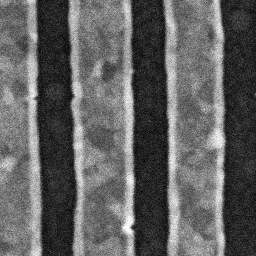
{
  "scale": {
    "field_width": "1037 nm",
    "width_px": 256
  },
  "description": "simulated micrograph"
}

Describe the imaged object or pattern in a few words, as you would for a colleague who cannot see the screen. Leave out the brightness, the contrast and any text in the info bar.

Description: one or a few lines or trenches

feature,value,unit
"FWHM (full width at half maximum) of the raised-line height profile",199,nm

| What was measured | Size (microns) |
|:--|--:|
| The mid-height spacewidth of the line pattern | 0.176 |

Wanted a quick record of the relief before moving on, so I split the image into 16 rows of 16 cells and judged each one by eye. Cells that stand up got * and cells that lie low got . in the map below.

**...***...***..
**...***...***..
**...***...***..
**...***...***..
**...***...***..
**...***...***..
**...***...***..
**...***...***..
**...***...***..
**...***...***..
**...***...***..
**...***...***..
**...***...***..
**...***...***..
**...***...***..
**...***...***..